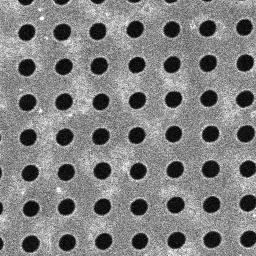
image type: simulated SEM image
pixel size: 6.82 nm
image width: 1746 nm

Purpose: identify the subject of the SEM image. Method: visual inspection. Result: a regular array of holes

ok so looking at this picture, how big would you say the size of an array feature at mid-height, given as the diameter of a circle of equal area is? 118 nm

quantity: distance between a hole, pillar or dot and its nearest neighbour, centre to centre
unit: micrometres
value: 0.238